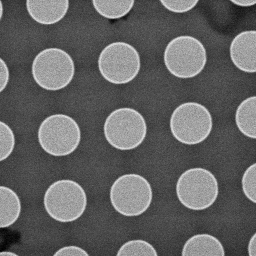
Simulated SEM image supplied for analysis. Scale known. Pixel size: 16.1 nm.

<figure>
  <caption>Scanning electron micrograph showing an array of small figures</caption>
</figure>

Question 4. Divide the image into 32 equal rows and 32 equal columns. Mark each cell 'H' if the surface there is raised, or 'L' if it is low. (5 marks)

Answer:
LLLHHHHHHLLLHHHHHLLLHHHHLLLLLLHH
LLLLHHHHLLLLHHHHLLLLLLHLLLLLLLLL
LLLLHHHLLLLLLLLLLLLLLLLLLLLLLLLL
LLLLLLLLLLLLLLLLLLLLLLLLLLLLLLLL
LLLLLLLLLLLLLLLLLLLLLLLLLLLLLLHH
LLLLLLLLLLLLLLHHLLLLLHHHHLLLLHHH
LLLLLHHHLLLLLHHHHLLLLHHHHHLLLHHH
LLLLHHHHHLLLHHHHHLLLLHHHHHLLLHHH
HLLLHHHHHLLLHHHHHLLLLHHHHLLLLLHH
HLLLHHHHHLLLLHHHHLLLLLHHLLLLLLLL
HLLLLHHHLLLLLLLLLLLLLLLLLLLLLLLL
LLLLLLLLLLLLLLLLLLLLLLLLLLLLLLLL
LLLLLLLLLLLLLLLLLLLLLLLLLLLLLLLH
LLLLLLLLLLLLLLLLLLLLLLHHHHLLLLHH
LLLLLLLHLLLLLLHHHHLLLHHHHHLLLHHH
HLLLLHHHHHLLLHHHHHLLLHHHHHLLLLHH
HLLLLHHHHHLLLHHHHHLLLLHHHHLLLLHH
HHLLLHHHHHLLLHHHHHLLLLHHHLLLLLLL
HHLLLHHHHLLLLLLHHLLLLLLLLLLLLLLL
HLLLLLLLLLLLLLLLLLLLLLLLLLLLLLLL
LLLLLLLLLLLLLLLLLLLLLLLLLLLLLLLL
LLLLLLLLLLLLLLLLLLLLLLLHHHLLLLLH
LLLLLLLLLLLLLLLHHHLLLLHHHHHLLLHH
HLLLLLHHHHLLLLHHHHHLLLHHHHHLLLHH
HHLLLLHHHHHLLLHHHHHLLLHHHHHLLLLH
HHLLLLHHHHHLLLHHHHHLLLLHHHLLLLLL
HHLLLLHHHHLLLLLHHHLLLLLLLLLLLLLL
HHLLLLLHHLLLLLLLLLLLLLLLLLLLLLLL
LLLLLLLLLLLLLLLLLLLLLLLLLLLLLLLL
LLLLLLLLLLLLLLLLLLLLLLLLHHLLLLLL
LLLLLLLLLLLLLLLLHHHLLLLHHHHHLLLH
LLLLLLLHHHHLLLLHHHHLLLLHHHHHLLLH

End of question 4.